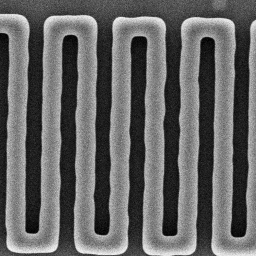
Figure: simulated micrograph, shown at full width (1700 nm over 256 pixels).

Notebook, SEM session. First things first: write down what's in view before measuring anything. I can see groups of lines, slits or small figures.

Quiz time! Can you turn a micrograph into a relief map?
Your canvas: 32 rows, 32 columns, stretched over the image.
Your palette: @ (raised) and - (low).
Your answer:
--------------------------------
--------------------------------
@@@---@@@@@@--@@@@@@---@@@@@@---
@@@@--@@@@@@--@@@@@@@--@@@@@@--@
-@@@--@@-@@@--@@@@@@@--@@@@@@--@
-@@---@@--@@--@@--@@@--@@--@@--@
-@@--@@@--@@--@@--@@@--@@--@@--@
-@@@-@@@--@@--@@--@@@--@@--@@--@
-@@--@@@--@@--@@--@@@--@@--@@--@
-@@--@@@--@@--@@--@@@--@@--@@--@
-@@--@@@--@@--@@--@@@--@@--@@--@
-@@--@@@--@@--@@--@@---@@--@@--@
-@@--@@@--@@--@@--@@@--@@--@@--@
-@@--@@@--@@--@@--@@@--@@--@@--@
-@@--@@@--@@--@@--@@@-@@@--@@--@
-@@--@@@--@@--@@--@@--@@@--@@--@
-@@--@@@--@@--@@--@@---@@--@@--@
-@@--@@@--@@--@@--@@--@@@--@@--@
-@@--@@@--@@--@@--@@--@@@--@@--@
-@@--@@@--@@--@@--@@--@@@--@@--@
-@@--@@---@@--@@--@@--@@@--@@--@
-@@--@@---@@--@@--@@--@@@--@@--@
-@@--@@@--@@--@@--@@---@@--@@--@
-@@--@@@--@@--@@--@@--@@@--@@--@
-@@--@@---@@--@@--@@--@@@--@@--@
-@@--@@--@@@--@@--@@--@@@--@@--@
-@@--@@--@@@--@@--@@--@@@--@@--@
-@@--@@--@@@--@@--@@--@@@--@@--@
-@@--@@--@@@--@@--@@--@@@--@@--@
-@@@@@@--@@@@@@@--@@@@@@@-@@@-@@
-@@@@@@--@@@@@@@--@@@@@@@-@@@@@@
--@@@@----@@@@@---@@@@@@---@@@@@